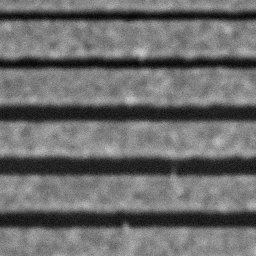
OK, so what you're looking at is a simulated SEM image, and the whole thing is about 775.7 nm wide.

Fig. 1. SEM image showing lines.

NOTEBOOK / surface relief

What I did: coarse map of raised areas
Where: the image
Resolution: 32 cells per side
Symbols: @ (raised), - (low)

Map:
@@@@@@@@@@@@@@@@@@@@@@@@@@@@@@@@
--------------------------------
--------------------------------
@@@@@@@@@@@@@@@@@@@@@@@@@@@@@@@@
@@@@@@@@@@@@@@@@@@@@@@@@@@@@@@@@
@@@@@@@@@@@@@@@@@@@@@@@@@@@@@@@@
@@@@@@@@@@@@@@@@@@@@@@@@@@@@@@@@
--------------------------------
--------------------------------
@@@@@@@@@@@@@@@@@@@@@@@@@@@@@@@@
@@@@@@@@@@@@@@@@@@@@@@@@@@@@@@@@
@@@@@@@@@@@@@@@@@@@@@@@@@@@@@@@@
@@@@@@@@@@@@@@@@@@@@@@@@@@@@@@@@
--------------------------------
--------------------------------
@@@@@@@@@@@@@@@@@@@@@@@@@@@@@@@@
@@@@@@@@@@@@@@@@@@@@@@@@@@@@@@@@
@@@@@@@@@@@@@@@@@@@@@@@@@@@@@@@@
@@@@@@@@@@@@@@@@@@@@@@@@@@@@@@@@
--------------------------------
--------------------------------
--------------------------------
@@@@@@@@@@@@@@@@@@@@@@@@@@@@@@@@
@@@@@@@@@@@@@@@@@@@@@@@@@@@@@@@@
@@@@@@@@@@@@@@@@@@@@@@@@@@@@@@@@
@@@@@@@@@@@@@@@@@@@@@@@@@@@@@@@@
--------------------------------
--------------------------------
---------------@---@------------
@@@@@@@@@@@@@@@@@@@@@@@@@@@@@@@@
@@@@@@@@@@@@@@@@@@@@@@@@@@@@@@@@
@@@@@@@@@@@@@@@@@@@@@@@@@@@@@@@@